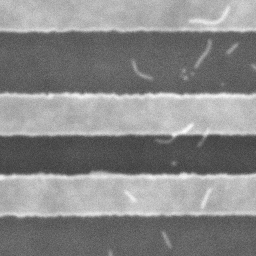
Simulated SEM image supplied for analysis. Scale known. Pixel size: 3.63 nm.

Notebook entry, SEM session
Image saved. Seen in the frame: lines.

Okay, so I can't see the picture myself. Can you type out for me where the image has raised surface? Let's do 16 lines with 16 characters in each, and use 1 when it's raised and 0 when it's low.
1111111111111111
1111111111111111
0000000000000000
0000000000000000
0000000000000000
0000000000000000
1111111111111111
1111111111111111
0000000000000000
0000000000000000
0000000000000000
1111111111111111
1111111111111111
0100000000000000
0000000000000000
0000000000000000